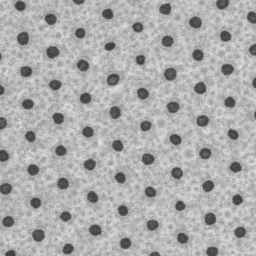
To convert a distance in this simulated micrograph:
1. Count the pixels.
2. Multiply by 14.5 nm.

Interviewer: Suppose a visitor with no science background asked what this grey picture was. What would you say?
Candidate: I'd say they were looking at a regular array of holes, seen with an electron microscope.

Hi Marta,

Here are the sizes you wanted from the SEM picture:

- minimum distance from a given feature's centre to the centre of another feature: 0.472 um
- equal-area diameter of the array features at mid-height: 12.3 px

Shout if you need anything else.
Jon